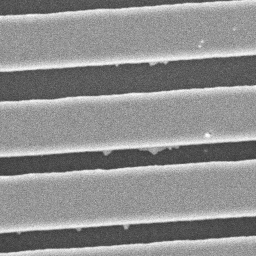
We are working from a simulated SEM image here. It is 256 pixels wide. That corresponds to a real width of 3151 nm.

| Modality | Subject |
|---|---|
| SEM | lines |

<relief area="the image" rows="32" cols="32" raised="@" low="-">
-----------------------@@@@@@@@@
---------@@@@@@@@@@@@@@@@@@@@@@@
@@@@@@@@@@@@@@@@@@@@@@@@@@@@@@@@
@@@@@@@@@@@@@@@@@@@@@@@@@@@@@@@@
@@@@@@@@@@@@@@@@@@@@@@@@@@@@@@@@
@@@@@@@@@@@@@@@@@@@@@@@@@@@@@@@@
@@@@@@@@@@@@@@@@@@@@@@@@@@@@@@@@
@@@@@@@@@@@@@@@@@@@@@@@---------
@@@@@@--------------------------
--------------------------------
--------------------------------
--------------------@@@@@@@@@@@@
------@@@@@@@@@@@@@@@@@@@@@@@@@@
@@@@@@@@@@@@@@@@@@@@@@@@@@@@@@@@
@@@@@@@@@@@@@@@@@@@@@@@@@@@@@@@@
@@@@@@@@@@@@@@@@@@@@@@@@@@@@@@@@
@@@@@@@@@@@@@@@@@@@@@@@@@@@@@@@@
@@@@@@@@@@@@@@@@@@@@@@@@@@@@@@@@
@@@@@@@@@@@@@@@@@@--------------
@@@-----------------------------
-----------------------@@@@@@@@@
---------@@@@@@@@@@@@@@@@@@@@@@@
@@@@@@@@@@@@@@@@@@@@@@@@@@@@@@@@
@@@@@@@@@@@@@@@@@@@@@@@@@@@@@@@@
@@@@@@@@@@@@@@@@@@@@@@@@@@@@@@@@
@@@@@@@@@@@@@@@@@@@@@@@@@@@@@@@@
@@@@@@@@@@@@@@@@@@@@@@@@@@@@@@@@
@@@@@@@@@@@@@@@@@@@@@@@@--------
@@@@@@@@@@----------------------
--------------------------------
------------------@@@@@@@@@@@@@@
--@@@@@@@@@@@@@@@@@@@@@@@@@@@@@@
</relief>